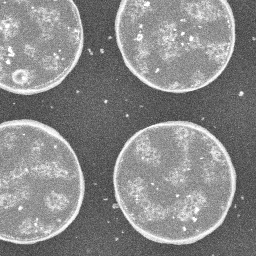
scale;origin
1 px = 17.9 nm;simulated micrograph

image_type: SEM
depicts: raised bodies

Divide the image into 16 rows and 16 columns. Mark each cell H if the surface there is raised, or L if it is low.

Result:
HHHHHLLLHHHHHHLL
HHHHHLLHHHHHHHHL
HHHHHLLHHHHHHHHL
HHHHHLLLHHHHHHLL
HHHHLLLLHHHHHHLL
HHHLLLLLLLHHLLLL
LLLLLLLLLLLLLLLL
LLLLLLLLLLLLLLLL
HHHHLLLLHHHHHLLL
HHHHHLLLHHHHHHLL
HHHHHLLHHHHHHHHL
HHHHHLLHHHHHHHHL
HHHHHLLHHHHHHHLL
HHHHHLLLHHHHHHLL
HHHHLLLLLHHHHLLL
LLLLLLLLLLLLLLLL